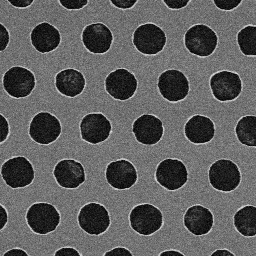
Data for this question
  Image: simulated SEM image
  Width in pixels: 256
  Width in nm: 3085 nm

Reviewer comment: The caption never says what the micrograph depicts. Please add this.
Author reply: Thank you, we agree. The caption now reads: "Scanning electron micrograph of a regular array of holes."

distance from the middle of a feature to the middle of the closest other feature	51.1	pixels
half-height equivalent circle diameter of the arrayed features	385	nm